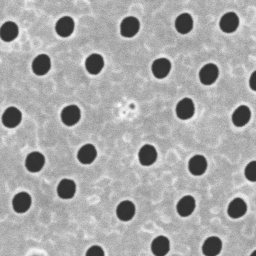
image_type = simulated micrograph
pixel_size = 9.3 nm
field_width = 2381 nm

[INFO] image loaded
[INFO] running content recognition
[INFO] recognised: a regular array of holes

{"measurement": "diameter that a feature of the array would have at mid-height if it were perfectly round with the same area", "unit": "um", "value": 0.189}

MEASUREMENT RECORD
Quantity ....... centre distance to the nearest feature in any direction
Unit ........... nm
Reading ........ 416